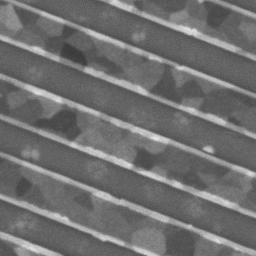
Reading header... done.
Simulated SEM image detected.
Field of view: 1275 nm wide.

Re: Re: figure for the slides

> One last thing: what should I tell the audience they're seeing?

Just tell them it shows one or a few lines or trenches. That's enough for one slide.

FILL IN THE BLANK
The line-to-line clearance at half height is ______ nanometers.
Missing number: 170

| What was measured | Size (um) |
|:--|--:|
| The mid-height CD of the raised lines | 0.193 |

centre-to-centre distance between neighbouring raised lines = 367 nm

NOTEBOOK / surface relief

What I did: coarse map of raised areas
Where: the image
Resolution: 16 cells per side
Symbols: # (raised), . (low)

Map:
##......#######.
####......######
#######......###
...#######.....#
.....#######....
##......#######.
#####......#####
#######......###
...#######......
......######....
##......#######.
#####......#####
#######......###
...#######......
......#######...
##......#######.